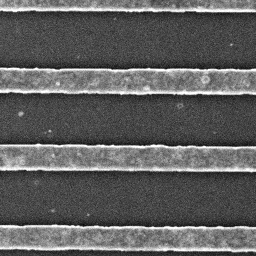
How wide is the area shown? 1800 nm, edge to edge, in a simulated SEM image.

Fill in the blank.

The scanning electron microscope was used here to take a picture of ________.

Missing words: lines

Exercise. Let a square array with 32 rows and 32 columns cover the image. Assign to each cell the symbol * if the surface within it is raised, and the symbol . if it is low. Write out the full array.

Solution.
********************************
................................
................................
................................
................................
................................
................................
................................
................................
********************************
********************************
...*.........*******************
................................
................................
................................
................................
................................
................................
********************************
********************************
********************************
................................
................................
................................
................................
................................
................................
................................
*******************.******.*.**.
********************************
********************************
................................